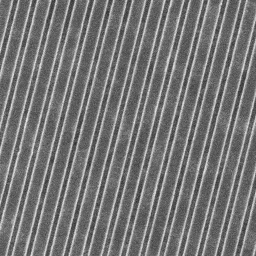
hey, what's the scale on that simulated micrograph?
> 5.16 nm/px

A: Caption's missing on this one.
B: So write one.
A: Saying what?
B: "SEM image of parallel lines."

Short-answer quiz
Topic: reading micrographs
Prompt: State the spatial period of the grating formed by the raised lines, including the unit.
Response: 95.3 nanometres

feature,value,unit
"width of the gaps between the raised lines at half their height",0.0282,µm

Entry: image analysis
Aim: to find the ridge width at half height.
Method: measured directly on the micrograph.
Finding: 68.9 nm